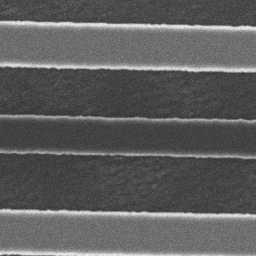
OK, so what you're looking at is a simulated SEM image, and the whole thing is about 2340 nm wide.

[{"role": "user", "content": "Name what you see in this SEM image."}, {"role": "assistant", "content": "lines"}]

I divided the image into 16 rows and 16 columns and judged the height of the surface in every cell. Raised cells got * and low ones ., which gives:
................
*******.........
****************
****************
................
................
................
***************.
****************
****************
................
................
................
****************
****************
****************